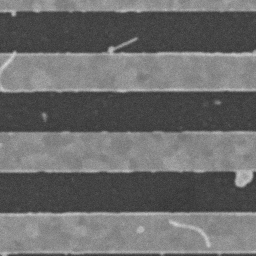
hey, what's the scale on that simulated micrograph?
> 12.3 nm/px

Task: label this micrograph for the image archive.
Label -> lines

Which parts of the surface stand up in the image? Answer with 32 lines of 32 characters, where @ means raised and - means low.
@@@@@@@@@@@@@@@@@@@@@@@@@@@@@@@@
--------------------------------
--------------------------------
--------------------------------
--------------------------------
--------------------------------
--------------------------------
@@@@@@@@@@@@@@@@@@@@@@@@@@@@@@@@
@@@@@@@@@@@@@@@@@@@@@@@@@@@@@@@@
@@@@@@@@@@@@@@@@@@@@@@@@@@@@@@@@
@@@@@@@@@@@@@@@@@@@@@@@@@@@@@@@@
--------------------------------
--------------------------------
--------------------------------
--------------------------------
--------------------------------
--------------------------------
@@@@@@@@@@@@@@@@@@@@@@@@@@@@@@@@
@@@@@@@@@@@@@@@@@@@@@@@@@@@@@@@@
@@@@@@@@@@@@@@@@@@@@@@@@@@@@@@@@
@@@@@@@@@@@@@@@@@@@@@@@@@@@@@@@@
------------------------------@-
--------------------------------
--------------------------------
--------------------------------
--------------------------------
--------------------------------
@@@@@@@@@@@@@@@@@@@@@@@@@@@@@@@@
@@@@@@@@@@@@@@@@@@@@@@@@@@@@@@@@
@@@@@@@@@@@@@@@@@@@@@@@@@@@@@@@@
@@@@@@@@@@@@@@@@@@@@@@@@@@@@@@@@
@@@@@@@@@@@@@@@@@@@@@@@@@@@@@@@@